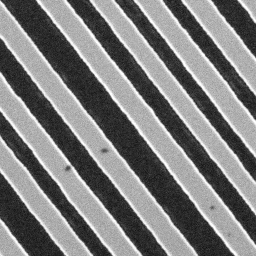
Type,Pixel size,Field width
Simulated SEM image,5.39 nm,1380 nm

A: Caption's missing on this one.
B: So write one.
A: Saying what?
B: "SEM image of lines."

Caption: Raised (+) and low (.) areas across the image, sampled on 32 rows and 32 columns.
.....++++...+++..++++..++++...++
+.....+++...+++...+++...+++....+
++.....+++...+++...+++...+++....
+++....++++...+++..++++..++++...
+++.....++++...+++..++++..++++..
.+++.....++++..++++..+++...++++.
.++++.....+++...+++...+++...+++.
..++++....++++...+++...+++...+++
...++++....++++...+++..++++..+++
....+++.....++++...+++..++++..++
+....+++.....+++...+++...+++...+
++...++++.....+++...+++...+++...
+++...++++....++++...+++..++++..
+++....+++.....++++...+++..++++.
.+++....+++.....+++...++++..+++.
.++++...++++.....+++...+++...+++
..++++...++++....++++...+++..+++
...++++...++++....++++...+++..++
+...+++....+++.....++++..++++..+
++..++++...++++.....+++...++++..
+++..++++...++++.....+++...+++..
++++..++++...++++....++++...+++.
.+++...+++....+++.....++++...+++
..+++...+++....+++.....++++..+++
..++++..++++...++++.....+++...++
...++++..++++...++++....++++...+
....+++...+++....++++....++++...
.....+++...+++....+++.....++++..
+....++++..++++...++++.....+++..
++....++++..++++...++++....++++.
++.....+++...++++...++++....++++
+++.....+++...+++....+++.....+++